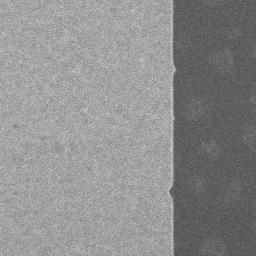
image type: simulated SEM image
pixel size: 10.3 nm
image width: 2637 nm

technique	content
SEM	one or a few lines or trenches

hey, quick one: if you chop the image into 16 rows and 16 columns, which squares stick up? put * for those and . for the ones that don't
***********.....
***********.....
***********.....
***********.....
***********.....
***********.....
***********.....
***********.....
***********.....
***********.....
***********.....
***********.....
***********.....
***********.....
***********.....
***********.....